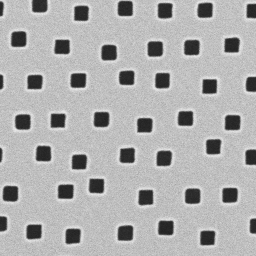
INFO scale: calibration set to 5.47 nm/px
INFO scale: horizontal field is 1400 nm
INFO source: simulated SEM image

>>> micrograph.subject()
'a regular array of holes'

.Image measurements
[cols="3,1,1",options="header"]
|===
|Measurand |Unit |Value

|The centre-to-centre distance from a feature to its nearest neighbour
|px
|37.1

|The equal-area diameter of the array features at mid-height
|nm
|92.2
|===